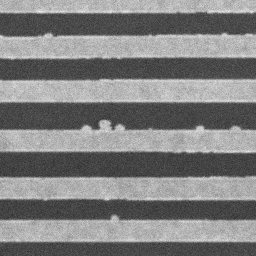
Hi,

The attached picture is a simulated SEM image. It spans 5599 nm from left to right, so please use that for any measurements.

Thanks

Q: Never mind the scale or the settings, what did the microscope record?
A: lines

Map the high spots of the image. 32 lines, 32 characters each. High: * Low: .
********************************
**.***..**....*.**..............
................................
................................
..........................*.****
********************************
********************************
................................
................................
................................
********************************
********************************
********************************
................................
................................
............**..................
********************************
********************************
********************************
................................
................................
................................
********************************
********************************
********************************
................................
................................
..............*.................
********************************
********************************
................................
................................